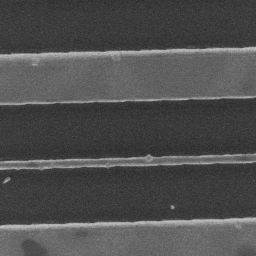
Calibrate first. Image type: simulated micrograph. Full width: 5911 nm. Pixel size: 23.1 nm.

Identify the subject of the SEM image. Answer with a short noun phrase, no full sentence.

lines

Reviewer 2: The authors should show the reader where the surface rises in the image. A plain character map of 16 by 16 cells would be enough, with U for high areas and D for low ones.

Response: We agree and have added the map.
DDDDDDDDDDDDDDDD
DDDDDDDDDDDDDDDD
DDDDDDDDDDDDDDDD
DUUUUUUUUUUUUUUU
UUUUUUUUUUUUUUUU
UUUUUUUUUUUUUUUU
UUDDDDDDDDDDDDDD
DDDDDDDDDDDDDDDD
DDDDDDDDDDDDDDDD
DDDDDDDDDDDDDDDD
DUUUDDDDDDDDDDDD
DDDDDDDDDDDDDDDD
DDDDDDDDDDDDDDDD
DDDDDDDDDDDDDDDD
UUUUUUUUUUUUUUUU
UUUUUUUUUUUUUUUU